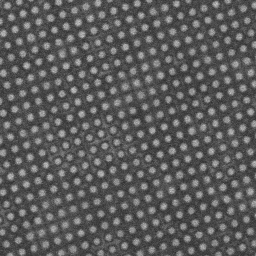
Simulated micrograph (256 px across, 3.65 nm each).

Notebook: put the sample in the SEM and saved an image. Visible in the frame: a regular array of raised bodies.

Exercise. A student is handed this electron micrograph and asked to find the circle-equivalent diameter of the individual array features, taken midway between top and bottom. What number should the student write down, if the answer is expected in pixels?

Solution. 6.38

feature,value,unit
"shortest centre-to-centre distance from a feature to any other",44.8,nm